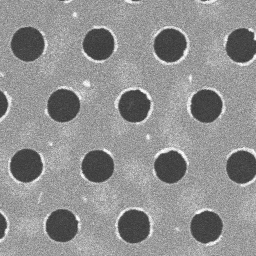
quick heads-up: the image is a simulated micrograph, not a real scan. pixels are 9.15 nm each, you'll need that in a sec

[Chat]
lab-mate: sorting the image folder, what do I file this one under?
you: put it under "a regular array of holes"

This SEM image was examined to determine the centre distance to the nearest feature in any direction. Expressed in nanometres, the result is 640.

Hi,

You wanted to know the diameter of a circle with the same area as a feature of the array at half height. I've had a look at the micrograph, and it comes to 0.304 micrometres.